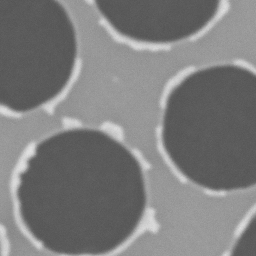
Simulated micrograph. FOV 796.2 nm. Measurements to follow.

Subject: holes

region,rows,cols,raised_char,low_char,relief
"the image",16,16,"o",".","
....oo........oo
.....oo......ooo
.....oooo..ooooo
.....ooooooooooo
....oooooooo....
....ooooooo.....
...ooooooo......
oooooooooo......
ooo....ooo......
oo......oo......
oo.......oo.....
o........ooo....
o........ooooooo
o........ooooooo
oo......ooooooo.
ooo....oooooooo.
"